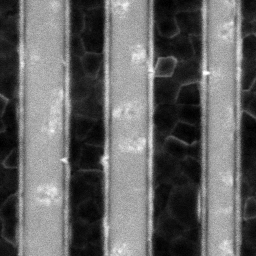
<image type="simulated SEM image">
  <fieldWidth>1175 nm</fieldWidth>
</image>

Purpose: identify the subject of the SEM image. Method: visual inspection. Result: one or a few lines or trenches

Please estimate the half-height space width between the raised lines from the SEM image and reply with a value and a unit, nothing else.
192 nm